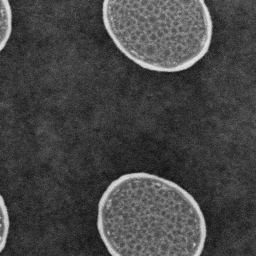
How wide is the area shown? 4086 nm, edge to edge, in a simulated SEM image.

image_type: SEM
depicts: raised bodies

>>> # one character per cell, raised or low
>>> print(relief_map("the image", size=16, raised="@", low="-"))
-------@@@@@@---
@------@@@@@@---
-------@@@@@@---
--------@@@@@---
----------------
----------------
----------------
----------------
----------------
----------------
----------------
-------@@@@-----
------@@@@@@----
------@@@@@@@---
------@@@@@@@---
-------@@@@@@---